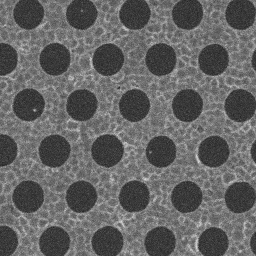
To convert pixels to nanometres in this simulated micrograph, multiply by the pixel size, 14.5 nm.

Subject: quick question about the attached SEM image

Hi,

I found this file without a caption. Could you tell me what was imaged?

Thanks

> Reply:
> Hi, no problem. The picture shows a regular array of holes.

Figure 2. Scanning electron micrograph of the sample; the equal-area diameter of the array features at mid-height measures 0.475 microns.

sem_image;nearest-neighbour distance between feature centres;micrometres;0.763